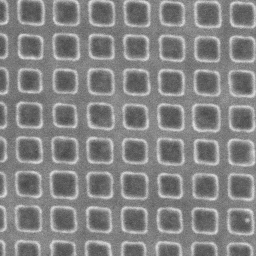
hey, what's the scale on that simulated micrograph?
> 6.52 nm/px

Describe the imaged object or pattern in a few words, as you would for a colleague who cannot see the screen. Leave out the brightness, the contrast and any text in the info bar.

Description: a regular array of raised bodies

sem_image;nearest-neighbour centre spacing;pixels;34.3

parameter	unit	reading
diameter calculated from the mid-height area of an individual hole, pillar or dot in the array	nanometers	180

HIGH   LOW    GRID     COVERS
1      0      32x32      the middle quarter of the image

00000000000000000000000000000000
10000011111000001110000011000000
11100011111100011111100011111100
11100011111100011111100011111100
11100011111100011111100011111100
11100011111110011111100011111100
11100011111100011111100011111100
00000000111100000111100001111100
00000000000000000000000000000000
00000000000000000000000000000000
11100011111100011111000011111000
11100011111100011111100011111100
11100011111100011111100011111100
11100011111100011111100011111100
11100011111100011111100011111100
11100011111100011111100011111100
00000000000000000000000000011000
00000000000000000000000000000000
00000001000000000000000000000000
11100011111100011111000111111000
11100011111100011111100111111100
11100011111100011111100111111100
11100011111100011111100111111100
11100011111100011111100011111100
11100001111100011111100011111100
00000000000000000000000000000000
00000000000000000000000000000000
11100011111000011111000000000000
11100011111100111111100011111000
11100011111100011111100011111000
11100011111100011111100011111000
11100011111100011111100011111000